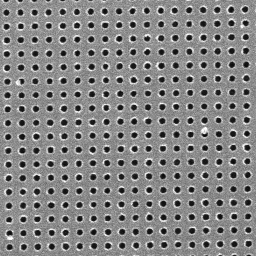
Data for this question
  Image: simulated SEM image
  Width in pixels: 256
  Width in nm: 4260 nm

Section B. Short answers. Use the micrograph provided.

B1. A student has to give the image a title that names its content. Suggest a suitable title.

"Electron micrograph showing a regular array of holes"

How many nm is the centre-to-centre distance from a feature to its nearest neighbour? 223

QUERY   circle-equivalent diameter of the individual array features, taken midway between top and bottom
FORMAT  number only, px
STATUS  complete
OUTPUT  6.48